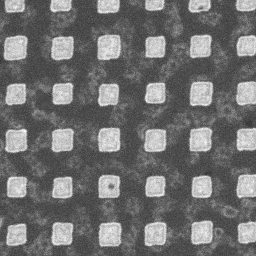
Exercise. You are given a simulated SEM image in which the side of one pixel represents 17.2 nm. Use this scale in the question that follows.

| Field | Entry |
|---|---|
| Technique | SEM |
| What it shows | a regular array of raised bodies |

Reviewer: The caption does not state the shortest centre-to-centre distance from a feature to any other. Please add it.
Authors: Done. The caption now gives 45.8 pixels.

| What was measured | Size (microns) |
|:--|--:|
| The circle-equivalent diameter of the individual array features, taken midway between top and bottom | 0.39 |